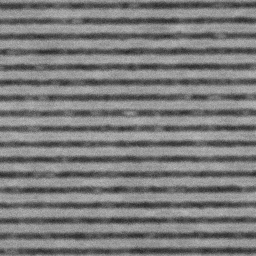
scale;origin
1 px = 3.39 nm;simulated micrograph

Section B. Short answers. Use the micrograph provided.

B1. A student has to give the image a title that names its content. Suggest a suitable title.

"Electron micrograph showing parallel lines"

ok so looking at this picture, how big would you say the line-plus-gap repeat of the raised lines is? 15.4 px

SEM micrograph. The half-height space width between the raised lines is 25.9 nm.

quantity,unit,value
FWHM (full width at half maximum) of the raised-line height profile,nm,25.9